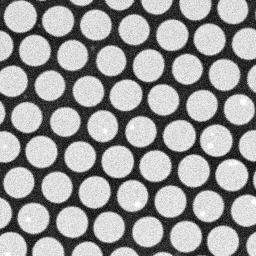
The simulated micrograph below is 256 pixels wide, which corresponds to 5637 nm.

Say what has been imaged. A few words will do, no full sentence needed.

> an array of small figures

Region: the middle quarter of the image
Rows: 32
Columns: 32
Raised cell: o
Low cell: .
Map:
ooooo...ooooooo..oooooooo..ooooo
.o.......oooooo..oooooooo..ooooo
..........oooo....oooooo...ooooo
....oooo...........ooooo....oooo
...oooooo.....oooo...........ooo
...ooooooo...oooooo....ooo......
..oooooooo..ooooooo...oooooo....
..oooooooo..ooooooo..ooooooo....
...ooooooo..ooooooo..oooooooo..o
...oooooo...ooooooo..oooooooo..o
......o......ooooo....oooooo...o
oo............oo......oooooo...o
ooo....ooooo...........ooo.....o
oooo..ooooooo.....ooo...........
oooo..ooooooo...oooooo.....oooo.
oooo..ooooooo...ooooooo...oooooo
ooo...ooooooo...ooooooo..ooooooo
oo....ooooooo...ooooooo..ooooooo
.......ooooo....ooooooo..ooooooo
...o............oooooo...ooooooo
.oooooo...........oo......oooooo
.oooooo....ooooo...........ooo..
oooooooo..ooooooo....oooo.......
oooooooo..ooooooo...oooooo....oo
oooooooo..ooooooo..oooooooo..ooo
.oooooo...ooooooo..oooooooo..ooo
..oooo....ooooooo..oooooooo..ooo
...........ooooo....oooooo...ooo
o.....ooo...........ooooo....ooo
oo...oooooo.....ooo...........oo
oo..ooooooo...oooooo...........o
oo..oooooooo..ooooooo...ooooo...